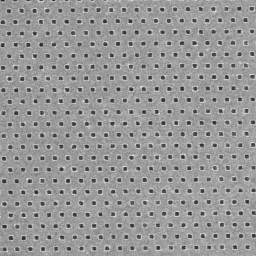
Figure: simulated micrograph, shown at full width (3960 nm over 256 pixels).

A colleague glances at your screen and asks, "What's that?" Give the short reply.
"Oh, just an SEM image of a regular array of holes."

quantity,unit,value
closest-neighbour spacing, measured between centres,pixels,12.6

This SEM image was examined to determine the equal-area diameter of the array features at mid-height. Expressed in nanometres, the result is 78.1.